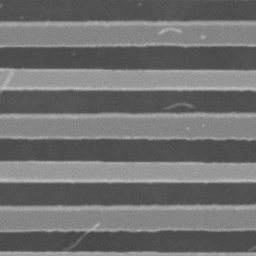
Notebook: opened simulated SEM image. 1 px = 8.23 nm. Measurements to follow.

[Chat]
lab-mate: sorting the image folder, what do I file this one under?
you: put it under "lines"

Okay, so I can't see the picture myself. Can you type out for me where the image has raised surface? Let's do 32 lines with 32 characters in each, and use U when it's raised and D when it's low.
DDDDDDDDDDDDDDDDDDDDDDDDDDDDDDDD
DDDDDDDDDDDDDDDDDDDDDDDDDDDDDDDD
DDDDDDDDDDDDDDDDDDDDDDDDDDDDDDDD
UUUUUUUUUUUUUUUUUUUUUUUUUUUUUUUU
UUUUUUUUUUUUUUUUUUUUUUUUUUUUUUUU
UUUUUUUUUUUUUUUUUUUUUUUUUUUUUUUU
DDDDDDDDDDDDDDDDDDDDDDDDDDDDDDDD
DDDDDDDDDDDDDDDDDDDDDDDDDDDDDDDD
DDDDDDDDDDDDDDDDDDDDDDDDDDDDDDDD
UUUUUUUUUUUUUUUUUUUUUUUUUUUUUUUU
UUUUUUUUUUUUUUUUUUUUUUUUUUUUUUUU
DDDDDDDDDDDDDDDDDDDDDDDDDDDDDDDD
DDDDDDDDDDDDDDDDDDDDDDDDDDDDDDDD
DDDDDDDDDDDDDDDDDDDDDDDDDDDDDDDD
UUUUUUUUUUUUUUUUUUUUUUUUUUUUUUUU
UUUUUUUUUUUUUUUUUUUUUUUUUUUUUUUU
UUUUUUUUUUUUUUUUUUUUUUUUUUUUUUUU
DDDDDDDDDDDDDDDDDDDDDDDDDDDDDDDU
DDDDDDDDDDDDDDDDDDDDDDDDDDDDDDDD
DDDDDDDDDDDDDDDDDDDDDDDDDDDDDDDD
UUUUUUUUUUUUUUUUUUUUUUUUUUUUUUUU
UUUUUUUUUUUUUUUUUUUUUUUUUUUUUUUU
UUUUUUUUUUUUUUUUUUUUUUUUUUUUUUUU
DDDDDDDDDDDDDDDDDDDDDDDDDDDDDDDD
DDDDDDDDDDDDDDDDDDDDDDDDDDDDDDDD
DDDDDDDDDDDDDDDDDDDDDDDDDDDDDDDD
UUUUUUUUUUUUUUUUUUUUUUUUUUUUUUUU
UUUUUUUUUUUUUUUUUUUUUUUUUUUUUUUU
UUUUUUUUUUUUUUUUUUUUUUUUUUUUUUUU
DDDDDDDDDDDDDDDDDDDDDDDDDDDDDDDD
DDDDDDDDDDDDDDDDDDDDDDDDDDDDDDDD
DDDDDDDDDDDDDDDDDDDDDDDDDDDDDDDD